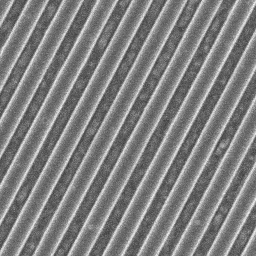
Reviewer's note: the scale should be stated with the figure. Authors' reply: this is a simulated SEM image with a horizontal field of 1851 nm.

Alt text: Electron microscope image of parallel lines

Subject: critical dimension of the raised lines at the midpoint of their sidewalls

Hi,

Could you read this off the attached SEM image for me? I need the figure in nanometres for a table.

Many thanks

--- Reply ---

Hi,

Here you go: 123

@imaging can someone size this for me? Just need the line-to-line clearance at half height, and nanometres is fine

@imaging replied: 96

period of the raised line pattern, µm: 0.223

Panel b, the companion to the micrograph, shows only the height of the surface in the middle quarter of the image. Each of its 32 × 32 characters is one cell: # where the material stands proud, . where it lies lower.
#####....####....#####....#####.
####....#####....#####....####..
####....####....#####....#####..
###....#####....#####...#####...
###....####....#####....#####...
##....#####....#####...#####....
##...#####....#####....#####....
#....#####....####....#####....#
#...#####....#####....#####...##
....#####...#####....#####....##
...#####....#####....####....###
...#####...#####....#####....###
..#####....#####....####....####
..####....#####....#####....####
.#####....#####....####....#####
.####....#####....#####....#####
#####....#####....####....#####.
####....#####....#####....#####.
####....#####....####....#####..
###....#####....#####....#####..
###....#####....####....#####...
##....#####....#####....#####...
##....#####...#####....#####....
#....#####....#####....####....#
#....#####...#####....#####....#
....#####....#####...#####....##
....####....#####....#####....##
...#####....#####...#####....###
..#####....#####....#####....###
..#####....####....#####....####
.#####....#####....#####....####
.#####....####....#####....#####